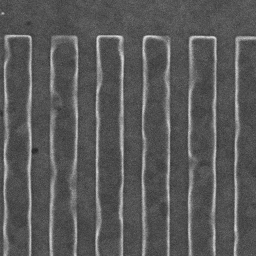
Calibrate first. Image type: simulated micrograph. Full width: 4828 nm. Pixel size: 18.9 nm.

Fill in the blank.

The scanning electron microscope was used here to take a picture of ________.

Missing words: wiring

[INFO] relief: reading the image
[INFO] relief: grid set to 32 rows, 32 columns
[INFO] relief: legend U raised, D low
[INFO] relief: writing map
DDDDDDDDDDDDDDDDDDDDDDDDDDDDDDDD
DDDDDDDDDDDDDDDDDDDDDDDDDDDDDDDD
DDDDDDDDDDDDDDDDDDDDDDDDDDDDDDDD
DDDDDDDDDDDDDDDDDDDDDDDDDDDDDDDD
DDDDDDDDDDDDDDDDDDDDDDDDDDDDDDDD
DUUUDDDUUUDDUUUDDDUUUDDDUUUDDDUU
DUUUDDUUUUDDUUUDDDUUUDDDUUUDDDUU
DUUUDDUUUUDDUUUDDDUUUDDDUUUDDDUU
DUUUDDUUUUDDUUUDDDUUUDDDUUUDDDUU
DUUUDDDUUUDDUUUDDDUUUDDDUUUDDDUU
DUUUDDUUUDDDUUUDDDUUUDDDUUUDDDUU
DUUUDDDUUDDDUUUDDDUUUDDDUUUDDDUU
DUUUDDDUUDDDUUUDDDUUUDDDUUUDDDUU
DUUUDDDUUUDDUUUDDDUUUDDDUUUDDDUU
DUUUDDDUUUDDUUUDDDUUUDDDUUUDDDUU
DUUUDDDUUUDDUUUDDDUUUDDDUUUDDDUU
DUUUDDUUUUDDUUUDDDUUUDDDUUUDDDUU
DUUUDDUUUUDDUUUDDDUUUDDDUUUDDDUU
DUUUDDUUUDDDUUUDDDUUUDDDUUUDDDUU
DUUUDDUUUDDDUUUDDDUUUDDDUUUDDDUU
DUUUDDDUUDDDUUUDDDUUUDDDUUUDDUUU
DUUUDDDUUDDDUUUDDDUUUDDDUUUDDUUU
DUUUDDDUUDDDUUUDDDUUUDDDUUUDDUUU
DUUUDDDUUDDDUUUDDDUUUDDDUUUDDDUU
DUUUDDDUUDDDUUUDDDUUUDDDUUUDDDUU
DUUUDDUUUDDDUUUDDDUUUDDDUUUDDDUU
DUUUDDUUUDDDUUUDDDUUUDDDUUUDDDUU
DUUUDDUUUDDDUUUDDDUUUDDDUUUDDUUU
DUUUDDUUUDDDUUUDDDUUUDDDUUUDDUUU
DUUUDDUUUDDDUUUDDDUUUDDDUUUDDDUU
DUUUDDUUUDDDUUUDDDUUUDDDUUUDDUUU
DUUUDDUUUDDDUUUDDDUUUDDDUUUDDUUU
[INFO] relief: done